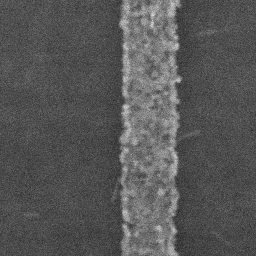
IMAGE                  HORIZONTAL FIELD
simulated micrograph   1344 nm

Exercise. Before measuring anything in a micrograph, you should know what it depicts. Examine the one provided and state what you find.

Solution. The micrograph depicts one or a few lines or trenches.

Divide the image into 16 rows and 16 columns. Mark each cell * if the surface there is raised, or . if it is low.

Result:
........***.....
........***.....
........***.....
........***.....
........***.....
........***.....
........***.....
........***.....
........***.....
........***.....
........***.....
........***.....
........***.....
........***.....
........***.....
........***.....